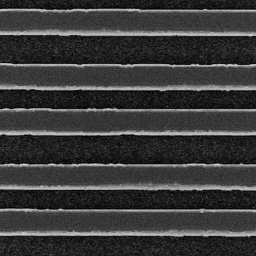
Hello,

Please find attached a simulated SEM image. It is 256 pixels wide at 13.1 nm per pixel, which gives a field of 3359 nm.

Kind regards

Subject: lines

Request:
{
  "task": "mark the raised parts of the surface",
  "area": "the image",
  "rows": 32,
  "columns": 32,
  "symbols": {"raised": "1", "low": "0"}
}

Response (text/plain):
00000000000000000000000000000000
11111111111111111111111111111111
11111111111111111111111111111111
11111111111111111111111111111111
00000000000000000000000000000000
00000000000000000000000000000000
00000000000000000000000000000000
00000000000000000000000000000000
11111111111111111111111111111111
11111111111111111111111111111111
11111111111111111111111111111111
00000000000000000000000000000000
00000000000000000000000000000000
00000000000000000000000000000000
11111111111111111111111111111111
11111111111111111111111111111111
11111111111111111111111111111111
00000000000000000000000000000000
00000000000000000000000000000000
00000000000000000000000000000000
00000000000000000000000000000000
11111111111111111111111111111111
11111111111111111111111111111111
11111111111111110111011111111111
00000000000000000000000000000000
00000000000000000000000000000000
11111111111111111111111111111111
11111111111111111111111111111111
11111111111111111111111111111111
00000000000000000000000000000000
00000000000000000000000000000000
00000000000000000000000000000000